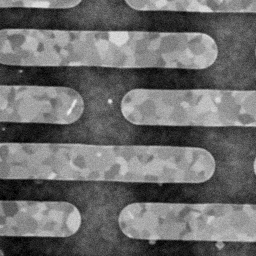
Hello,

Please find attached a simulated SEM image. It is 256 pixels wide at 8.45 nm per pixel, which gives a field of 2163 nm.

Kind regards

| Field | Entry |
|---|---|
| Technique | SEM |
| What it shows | groups of lines, slits or small figures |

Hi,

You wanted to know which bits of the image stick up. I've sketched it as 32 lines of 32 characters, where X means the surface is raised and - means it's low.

XXXXXXXXXX------XXXXXXXXXXXXXXXX
--------------------------------
--------------------------------
--------------------------------
XXXXXXXXXXXXXXXXXXXXXXXXXX------
XXXXXXXXXXXXXXXXXXXXXXXXXXX-----
XXXXXXXXXXXXXXXXXXXXXXXXXXX-----
XXXXXXXXXXXXXXXXXXXXXXXXXXX-----
--------------------------------
--------------------------------
--------------------------------
XXXXXXXXXX------XXXXXXXXXXXXXXXX
XXXXXXXXXX-----XXXXXXXXXXXXXXXXX
XXXXXXXXXX-----XXXXXXXXXXXXXXXXX
XXXXXXXXXX------XXXXXXXXXXXXXXXX
-----------------XXXXXXXXXXXXXXX
--------------------------------
--------------------------------
XXXXXXXXXXXXXXXXXXXXXXXX--------
XXXXXXXXXXXXXXXXXXXXXXXXXX------
XXXXXXXXXXXXXXXXXXXXXXXXXXX-----
XXXXXXXXXXXXXXXXXXXXXXXXXXX-----
------------XXXXXXXXXXXXXX------
--------------------------------
--------------------------------
XXXXXXXXX--------XXXX-----------
XXXXXXXXXX-----XXXXXXXXXXXXXXXXX
XXXXXXXXXX-----XXXXXXXXXXXXXXXXX
XXXXXXXXXX-----XXXXXXXXXXXXXXXXX
-------X--------XXXXXXXXXXXXXXXX
--------------------------------
--------------------------------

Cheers